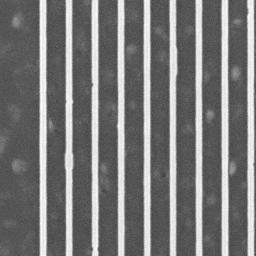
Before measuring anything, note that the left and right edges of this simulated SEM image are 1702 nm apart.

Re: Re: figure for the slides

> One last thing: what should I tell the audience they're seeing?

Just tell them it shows parallel lines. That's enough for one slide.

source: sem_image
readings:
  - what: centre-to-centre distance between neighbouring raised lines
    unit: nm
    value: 173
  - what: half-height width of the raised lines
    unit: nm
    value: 36.6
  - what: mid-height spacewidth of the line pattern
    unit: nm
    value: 140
